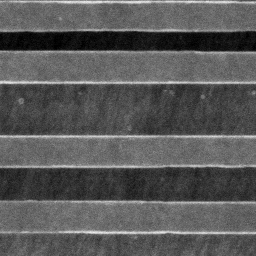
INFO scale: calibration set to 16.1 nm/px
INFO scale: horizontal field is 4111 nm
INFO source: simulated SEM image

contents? lines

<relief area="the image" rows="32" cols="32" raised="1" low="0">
11111111111111111111111111111111
11111111111111111111111111111111
11111111111111111111111111111111
11111111111111111111111111111111
00000000000000000000000000000000
00000000000000000000000000000000
11111111111111111111111110000000
11111111111111111111111111111111
11111111111111111111111111111111
11111111111111111111111111111111
00000000000000000000000000000000
00000000000000000000000000000000
00000000000000000000000000000000
00000000000000000000000000000000
00000000000000000000000000000000
00000000000000000000000000000000
00000000000000000000000000000000
11111111111111111111111111111111
11111111111111111111111111111111
11111111111111111111111111111111
11111111111111111111111111111111
00000000000000000000000000000000
00000000000000000000000000000000
00000000000000000000000000000000
00000000000000000000000000000000
11111111111111111111111111111111
11111111111111111111111111111111
11111111111111111111111111111111
11111111111111111111111111111111
00000000000000000000000000000000
00000000000000000000000000000000
00000000000000000000000000000000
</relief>